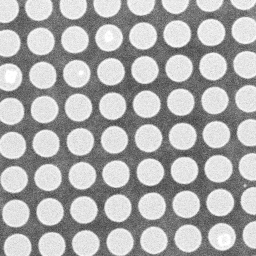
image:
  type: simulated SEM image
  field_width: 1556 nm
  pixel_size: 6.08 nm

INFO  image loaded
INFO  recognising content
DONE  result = an array of small figures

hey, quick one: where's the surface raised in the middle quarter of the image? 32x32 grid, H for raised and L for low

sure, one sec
LHHHHHLLLHHHHHHLLHHHHHHLLLHHHHHH
HHHHHHLLLHHHHHHLLHHHHHHLLLHHHHHH
HHHHHHLLLHHHHHHLLHHHHHHLLLHHHHHH
HHHHHHLLLHHHHHHLLLHHHHHLLLLHHHHL
LHHHHHLLLLHHHHLLLLLHHHLLLLLLLLLL
LLHHLLLLLLLLLLLLLLLLLLLLLLLLLLLL
LLLLLLLLLLLLLLLLLLLLLLLLLLLLLHLL
LLLLLLLLLLLHHLLLLLLHHHHLLLLHHHHH
LHHHHHLLLLHHHHHLLLHHHHHLLLHHHHHH
LHHHHHHLLHHHHHHLLLHHHHHHLLHHHHHH
LHHHHHHLLHHHHHHLLHHHHHHHLLHHHHHH
LHHHHHHLLHHHHHHLLLHHHHHHLLLHHHHH
LHHHHHLLLLHHHHHLLLLHHHHLLLLLHHLL
LLHHHHLLLLLHHLLLLLLLLLLLLLLLLLLL
LLLLLLLLLLLLLLLLLLLLLLLLLLLLLLLL
LLLLLLLLLLLLLLLLLLLLHHLLLLLLHHHH
LLLHHLLLLLLHHHHLLLLHHHHHLLLHHHHH
LLHHHHHLLLHHHHHLLLHHHHHHLLHHHHHH
LHHHHHHLLHHHHHHHLLHHHHHHLLHHHHHH
LHHHHHHLLHHHHHHHLLHHHHHHLLLHHHHH
LHHHHHHLLLHHHHHLLLLHHHHHLLLHHHHH
LLHHHHHLLLLHHHHLLLLLHHHLLLLLLLLL
LLLHHLLLLLLLLLLLLLLLLLLLLLLLLLLL
LLLLLLLLLLLLLLLLLLLLLLLLLLLLLLLL
LLLLLLLLLLLLHHLLLLLLHHHLLLLLHHHH
LLHHHHHLLLLHHHHHLLLHHHHHLLLHHHHH
LLHHHHHLLLHHHHHHLLHHHHHHHLLHHHHH
LHHHHHHHLLHHHHHHLLLHHHHHHLLHHHHH
LHHHHHHHLLHHHHHHLLLHHHHHLLLHHHHH
LLHHHHHLLLLHHHHHLLLHHHHHLLLLLHHH
LLHHHHLLLLLLHHLLLLLLLLLLLLLLLLLL
LLLLLLLLLLLLLLLLLLLLLLLLLLLLLLLL